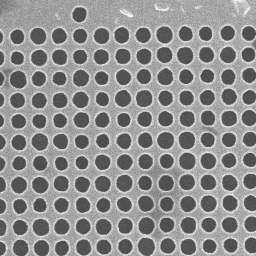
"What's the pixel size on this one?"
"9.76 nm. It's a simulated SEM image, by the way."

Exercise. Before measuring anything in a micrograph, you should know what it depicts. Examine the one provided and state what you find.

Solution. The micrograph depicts a regular array of holes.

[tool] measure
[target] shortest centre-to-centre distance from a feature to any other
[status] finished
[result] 0.201 um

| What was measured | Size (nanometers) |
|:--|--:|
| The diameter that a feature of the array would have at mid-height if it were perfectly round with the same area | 147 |